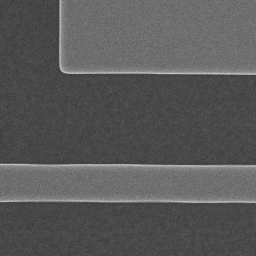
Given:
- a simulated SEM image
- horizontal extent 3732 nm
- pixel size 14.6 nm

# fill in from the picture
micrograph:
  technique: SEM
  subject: groups of lines, slits or small figures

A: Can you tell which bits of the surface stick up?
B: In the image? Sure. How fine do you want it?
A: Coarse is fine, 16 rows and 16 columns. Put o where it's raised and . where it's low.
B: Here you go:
....oooooooooooo
....oooooooooooo
....oooooooooooo
....oooooooooooo
....oooooooooooo
................
................
................
................
................
oooooooooooooooo
oooooooooooooooo
oooooooooooooooo
................
................
................